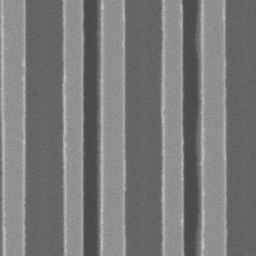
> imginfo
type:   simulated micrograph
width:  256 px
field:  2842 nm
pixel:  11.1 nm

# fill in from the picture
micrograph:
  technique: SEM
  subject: lines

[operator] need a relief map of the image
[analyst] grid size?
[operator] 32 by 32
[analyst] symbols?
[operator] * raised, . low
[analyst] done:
***.....**...**.....***..***....
***.....**...***....***..***....
***.....**...***....***..***....
***.....**...***....***..***....
***.....**...***....***..***....
***.....**...***....***..***....
***.....**...***....***..***....
***.....**...***....***..***....
***.....**...***....***..***....
***.....**...***....***..***....
***.....**...***....***..***....
***.....**...***....***..***....
***.....**...***....***..***....
***.....**...***....***..***....
***.....**...***....***..***....
***.....**...***....***..***....
***.....**...***....***..***....
***.....**...***....***..***....
***.....**...***....***..***....
***.....**...***....***..***....
***.....**...***....***..***....
***.....**...***....***..***....
***.....**...***....***..***....
***.....**...***....***..***....
***.....**...***....***..***....
***.....**...***....***..***....
***.....**...***....***..***....
***.....**...***....***..***....
***.....**...***....***..***....
***.....**...***....***..***....
***.....**...***....***..***....
***.....**...***....***..***....